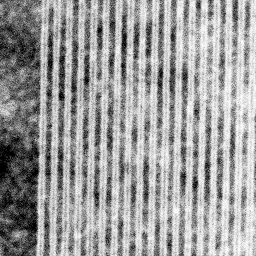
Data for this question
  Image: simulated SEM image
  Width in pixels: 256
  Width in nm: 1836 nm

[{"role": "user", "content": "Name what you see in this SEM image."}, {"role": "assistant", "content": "parallel lines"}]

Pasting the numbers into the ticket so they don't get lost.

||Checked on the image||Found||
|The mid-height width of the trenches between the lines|61.8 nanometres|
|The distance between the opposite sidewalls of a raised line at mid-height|27.8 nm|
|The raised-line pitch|0.088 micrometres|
